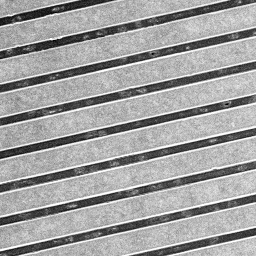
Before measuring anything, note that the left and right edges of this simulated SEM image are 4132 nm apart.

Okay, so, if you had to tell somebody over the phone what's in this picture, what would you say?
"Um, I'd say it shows parallel lines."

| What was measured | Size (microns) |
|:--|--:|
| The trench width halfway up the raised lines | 0.16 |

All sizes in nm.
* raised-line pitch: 526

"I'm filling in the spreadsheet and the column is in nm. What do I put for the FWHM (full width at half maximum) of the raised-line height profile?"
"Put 366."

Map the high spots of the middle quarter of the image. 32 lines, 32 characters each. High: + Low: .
++++...........+++++++++++++++++
...........+++++++++++++++++++++
......++++++++++++++++++++++++++
..+++++++++++++++++++++++++.....
+++++++++++++++++++++++.........
++++++++++++++++++............++
++++++++++++++............++++++
+++++++++............+++++++++++
+++++............+++++++++++++++
............++++++++++++++++++++
........++++++++++++++++++++++++
...++++++++++++++++++++++++++...
++++++++++++++++++++++++........
++++++++++++++++++++............
+++++++++++++++...........++++++
+++++++++++............+++++++++
++++++............++++++++++++++
++............++++++++++++++++++
.........+++++++++++++++++++++++
.....++++++++++++++++++++++++++.
++++++++++++++++++++++++++......
++++++++++++++++++++++..........
+++++++++++++++++............+++
+++++++++++++...........++++++++
++++++++............++++++++++++
++++...........+++++++++++++++++
...........+++++++++++++++++++++
......++++++++++++++++++++++++++
..++++++++++++++++++++++++++....
+++++++++++++++++++++++.........
+++++++++++++++++++...........++
++++++++++++++............++++++